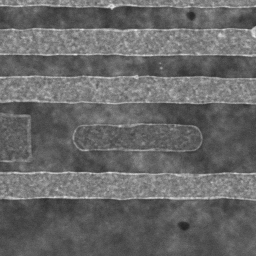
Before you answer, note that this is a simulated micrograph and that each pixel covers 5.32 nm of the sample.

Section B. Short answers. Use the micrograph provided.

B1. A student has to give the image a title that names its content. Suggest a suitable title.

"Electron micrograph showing groups of lines, slits or small figures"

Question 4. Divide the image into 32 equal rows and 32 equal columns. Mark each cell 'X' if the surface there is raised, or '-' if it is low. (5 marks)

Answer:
XXXXXXXXXXXXXXXXXXXXXXXXXXXXXXXX
--------------------------------
--------------------------------
--------------------------------
XXXXXXXXXXXXXXXXXXXXXXXXXXXXXXXX
XXXXXXXXXXXXXXXXXXXXXXXXXXXXXXXX
XXXXXXXXXXXXXXXXXXXXXXXXXXXXXXXX
--------------------------------
--------------------------------
--------------------------------
XXXXXXXXXXXXXXXXXXXXXXXXXXXXXXXX
XXXXXXXXXXXXXXXXXXXXXXXXXXXXXXXX
XXXXXXXXXXXXXXXXXXXXXXXXXXXXXXXX
--------------------------------
X-------------------------------
XXXX-------------X--------------
XXXX-----XXXXXXXXXXXXXXXX-------
XXXX-----XXXXXXXXXXXXXXXX-------
XXXX------XXXXXXXXXXXXXXX-------
XXXX----------------------------
--------------------------------
--------------------------------
XXXXXXXXXXXXXXXXXXXXXXXXXXXXXXXX
XXXXXXXXXXXXXXXXXXXXXXXXXXXXXXXX
XXXXXXXXXXXXXXXXXXXXXXXXXXXXXXXX
--------------------------------
--------------------------------
--------------------------------
--------------------------------
--------------------------------
--------------------------------
--------------------------------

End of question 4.